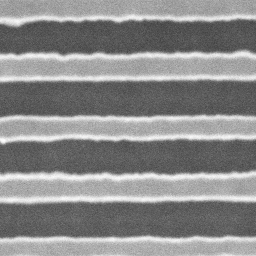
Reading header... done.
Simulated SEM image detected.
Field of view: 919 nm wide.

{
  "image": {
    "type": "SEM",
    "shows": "lines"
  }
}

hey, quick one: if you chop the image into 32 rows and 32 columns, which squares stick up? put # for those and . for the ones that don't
################################
################################
####...#.#....##......#...#.....
................................
................................
................................
................................
################################
################################
################################
................................
................................
................................
................................
................................
################################
################################
##..............................
................................
................................
................................
................................
################################
################################
################################
................................
................................
................................
................................
................................
################################
################################